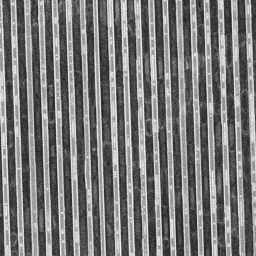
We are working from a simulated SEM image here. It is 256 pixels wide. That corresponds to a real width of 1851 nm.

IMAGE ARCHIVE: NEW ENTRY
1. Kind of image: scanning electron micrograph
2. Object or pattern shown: parallel lines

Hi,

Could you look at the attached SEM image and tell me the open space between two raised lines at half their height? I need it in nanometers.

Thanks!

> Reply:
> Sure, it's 66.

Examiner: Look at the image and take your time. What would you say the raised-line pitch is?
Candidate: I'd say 99.9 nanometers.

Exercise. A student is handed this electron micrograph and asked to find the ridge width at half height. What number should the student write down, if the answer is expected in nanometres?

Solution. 33.4